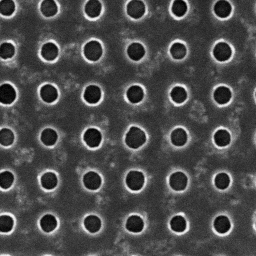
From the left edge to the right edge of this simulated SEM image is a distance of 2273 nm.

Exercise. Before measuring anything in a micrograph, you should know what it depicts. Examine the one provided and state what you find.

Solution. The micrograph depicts a regular array of holes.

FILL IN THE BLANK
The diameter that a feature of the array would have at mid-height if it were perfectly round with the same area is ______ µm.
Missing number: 0.163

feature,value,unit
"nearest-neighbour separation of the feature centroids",0.38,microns